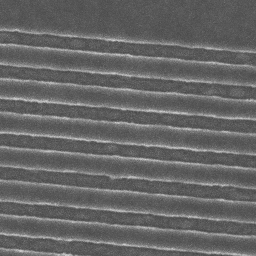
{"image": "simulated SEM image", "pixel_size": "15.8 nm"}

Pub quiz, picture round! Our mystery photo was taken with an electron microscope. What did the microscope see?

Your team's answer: parallel lines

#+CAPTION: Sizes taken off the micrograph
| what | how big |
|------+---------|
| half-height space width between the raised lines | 215 nm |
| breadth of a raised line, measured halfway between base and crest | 323 nanometres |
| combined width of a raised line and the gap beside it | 0.537 microns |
